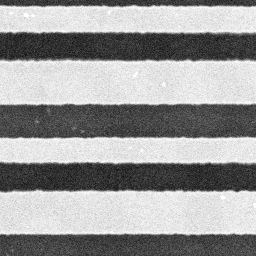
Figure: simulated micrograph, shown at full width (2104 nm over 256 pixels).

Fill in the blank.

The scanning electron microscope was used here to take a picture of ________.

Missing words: lines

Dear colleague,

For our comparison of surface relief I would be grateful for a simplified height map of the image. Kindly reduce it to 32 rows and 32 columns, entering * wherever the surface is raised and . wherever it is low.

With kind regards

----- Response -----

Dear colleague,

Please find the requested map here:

................................
********************************
********************************
********************************
................................
................................
................................
................................
********************************
********************************
********************************
********************************
********************************
................................
................................
................................
................................
********************************
********************************
********************************
................................
................................
................................
................................
********************************
********************************
********************************
********************************
********************************
................................
................................
................................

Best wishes